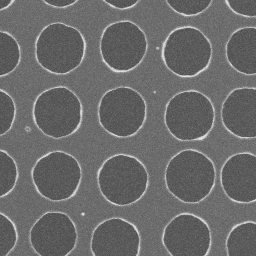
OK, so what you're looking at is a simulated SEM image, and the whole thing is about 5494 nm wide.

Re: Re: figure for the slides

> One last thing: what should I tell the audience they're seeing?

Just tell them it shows a regular array of holes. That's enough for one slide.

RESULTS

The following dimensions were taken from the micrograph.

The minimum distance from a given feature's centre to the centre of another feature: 1370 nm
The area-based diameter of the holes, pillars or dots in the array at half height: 1040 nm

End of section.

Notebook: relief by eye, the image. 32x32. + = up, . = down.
.+++++...+++++...++++.....+++...
++++++++++++++++++++++...+++++..
++++++++++++++++++++++++++++++++
++++++...++++....++++++.+++++++.
.++++.....+++.....+++.....+++...
..+++.....+++.....+++.....++....
..+++.....+++.....++......++....
..+++.....+++.....+++.....+++...
..++++...+++++...++++.....+++...
++++++++++++++++++++++++++++++++
++++++++++++++++++++++++++++++++
++++++...+++++...++++++..++++...
.++++.....+++.....+++.....++....
..++......++......+++......+....
..++......++......+++......+....
.++++.....+++.....+++......+....
.++++....+++++...++++.....+++...
++++++++++++++++++++++++++++++++
++++++++++++++++++++++++++++++++
.+++++...++++++.++++++....+++...
..+++.....+++.....+++......+....
..++......++......+++......+....
..++......++......+++......+....
..+++.....+++.....+++.....++....
++++++...++++.....++++....+++...
++++++++++++++..++++++++++++++++
++++++++++++++++++++++++++++++++
.++++....+++++.+++++++...+++++++
..++.....+++.....++++.....+++...
..++......++.....+++......+++...
..++.....++......++++.....++....
.++++....+++.....++++.....+++...